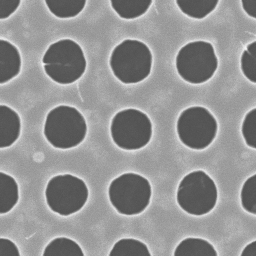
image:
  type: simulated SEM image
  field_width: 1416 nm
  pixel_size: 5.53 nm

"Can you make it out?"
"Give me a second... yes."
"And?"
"a regular array of holes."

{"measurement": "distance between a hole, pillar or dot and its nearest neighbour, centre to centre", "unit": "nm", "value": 362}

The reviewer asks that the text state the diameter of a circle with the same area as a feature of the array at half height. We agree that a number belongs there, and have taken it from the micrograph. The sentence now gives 230 nm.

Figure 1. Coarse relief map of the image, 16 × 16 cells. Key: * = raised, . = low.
.**..**..**..**.
****************
****************
.**..**..**..**.
.**..**..**..**.
****************
****************
.**..**..**..**.
.**..**..**..**.
****************
****************
.**..**..**..**.
.**..**..**..**.
****************
****************
.**..**..**..**.